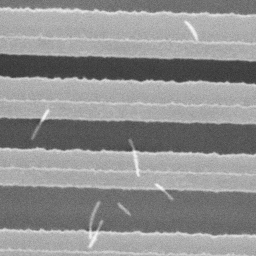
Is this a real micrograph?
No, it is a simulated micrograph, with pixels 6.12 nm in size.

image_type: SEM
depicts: lines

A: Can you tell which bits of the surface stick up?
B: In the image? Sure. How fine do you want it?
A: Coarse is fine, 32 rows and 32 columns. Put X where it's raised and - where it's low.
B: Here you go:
--------------------------------
XXXXXXXXXXXXX-XX----------------
XXXXXXXXXXXXXXXXXXXXXXXXXXXXXXXX
XXXXXXXXXXXXXXXXXXXXXXXXXXXXXXXX
XXXXXXXXXXXXXXXXXXXXXXXXXXXXXXXX
XXXXXXXXXXXXXXXXXXXXXXXXXXXXXXXX
XXXXXXXXXXXXXXXXXXXXXXXXXXXXXXXX
-------------------------------X
--------------------------------
--------------------------------
XXXXXXXXXXXXXXXXXXXXXXXXXXXXXXX-
XXXXXXXXXXXXXXXXXXXXXXXXXXXXXXXX
XXXXXXXXXXXXXXXXXXXXXXXXXXXXXXXX
XXXXXXXXXXXXXXXXXXXXXXXXXXXXXXXX
XXXXXXXXXXXXXXXXXXXXXXXXXXXXXXXX
--------------------------------
--------------------------------
--------------------------------
--------------------------------
XXXXXXXXXXXXXXXXXXXXXXXXXXXXXXXX
XXXXXXXXXXXXXXXXXXXXXXXXXXXXXXXX
XXXXXXXXXXXXXXXXXXXXXXXXXXXXXXXX
XXXXXXXXXXXXXXXXXXXXXXXXXXXXXXXX
---------------XXXXXXXXXXXXXXXXX
--------------------------------
--------------------------------
--------------------------------
--------------------------------
--------------------------------
XXXXXXXXXXXXXXXXXXXXXXXXXXXXXXXX
XXXXXXXXXXXXXXXXXXXXXXXXXXXXXXXX
XXXXXXXXXXXXXXXXXXXXXXXXXXXXXXXX